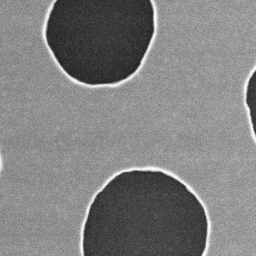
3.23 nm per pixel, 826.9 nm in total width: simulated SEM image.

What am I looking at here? holes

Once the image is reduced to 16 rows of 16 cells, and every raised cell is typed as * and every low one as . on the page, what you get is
***.......******
***.......******
***......*******
***......*******
****....********
***************.
***************.
****************
****************
****************
****************
*******....*****
******......****
*****........***
*****........***
*****........***